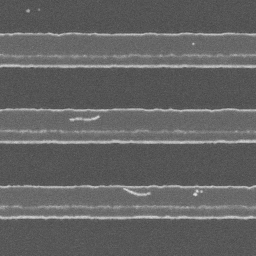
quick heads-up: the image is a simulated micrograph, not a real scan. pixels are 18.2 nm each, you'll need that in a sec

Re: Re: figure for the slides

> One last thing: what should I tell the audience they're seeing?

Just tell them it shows lines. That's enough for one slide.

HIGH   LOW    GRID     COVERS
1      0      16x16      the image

0000000000000000
0000000000000000
1111111111111111
1111111111111111
0000000000000000
0000000000000000
0000000000000000
1111111111111111
1111111111111111
0000000000000000
0000000000000000
0000000000000000
1111111111111111
1111111111111111
0000000000000000
0000000000000000